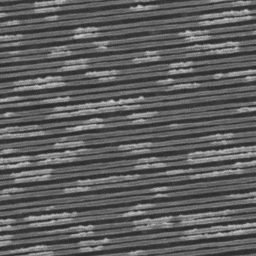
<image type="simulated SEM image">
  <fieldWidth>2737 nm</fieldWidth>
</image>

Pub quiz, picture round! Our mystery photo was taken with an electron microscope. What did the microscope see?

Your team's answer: parallel lines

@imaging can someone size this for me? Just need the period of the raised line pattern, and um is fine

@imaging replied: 0.0809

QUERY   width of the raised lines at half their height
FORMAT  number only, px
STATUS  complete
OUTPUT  3.23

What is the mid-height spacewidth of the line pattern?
50.5 nm